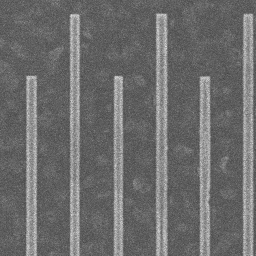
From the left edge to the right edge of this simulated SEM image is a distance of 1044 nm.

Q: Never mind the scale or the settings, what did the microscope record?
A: parallel lines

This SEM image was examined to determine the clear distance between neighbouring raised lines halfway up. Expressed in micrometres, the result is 0.143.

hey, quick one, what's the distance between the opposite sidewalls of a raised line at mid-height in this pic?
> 0.0357 um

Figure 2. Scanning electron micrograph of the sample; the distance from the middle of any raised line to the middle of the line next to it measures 176 nm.